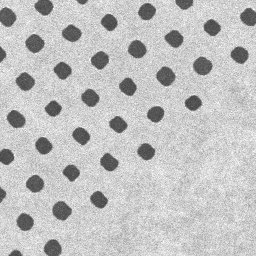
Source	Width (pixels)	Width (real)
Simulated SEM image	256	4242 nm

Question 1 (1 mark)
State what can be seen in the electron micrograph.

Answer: a regular array of holes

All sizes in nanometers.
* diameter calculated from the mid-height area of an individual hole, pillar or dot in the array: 282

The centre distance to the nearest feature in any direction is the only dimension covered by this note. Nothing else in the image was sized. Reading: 38.3 pixels